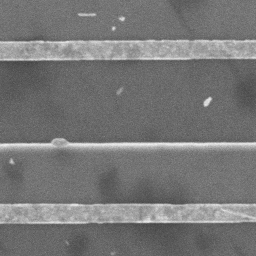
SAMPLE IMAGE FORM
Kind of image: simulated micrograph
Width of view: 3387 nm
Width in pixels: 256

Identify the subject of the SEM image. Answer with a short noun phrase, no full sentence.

lines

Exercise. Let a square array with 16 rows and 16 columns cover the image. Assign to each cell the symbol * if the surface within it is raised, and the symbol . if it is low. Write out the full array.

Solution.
****************
****************
****************
****************
................
................
................
................
................
****************
****************
****************
****************
****************
................
................